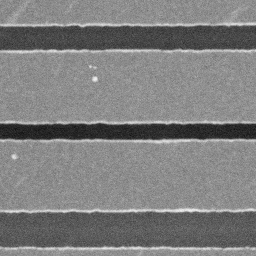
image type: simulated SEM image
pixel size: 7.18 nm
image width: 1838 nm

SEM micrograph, lines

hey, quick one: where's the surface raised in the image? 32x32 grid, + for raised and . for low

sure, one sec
++++++++++++++++++++++++++++++++
++++++++++++++++++++++++++++++++
++++++++++++++++++++++++++++++++
................................
................................
................................
++++++++++++++++++++++++++++++++
++++++++++++++++++++++++++++++++
++++++++++++++++++++++++++++++++
++++++++++++++++++++++++++++++++
++++++++++++++++++++++++++++++++
++++++++++++++++++++++++++++++++
++++++++++++++++++++++++++++++++
++++++++++++++++++++++++++++++++
++++++++++++++++++++++++++++++++
................................
................................
++.+..+++.++++........++++++++++
++++++++++++++++++++++++++++++++
++++++++++++++++++++++++++++++++
++++++++++++++++++++++++++++++++
++++++++++++++++++++++++++++++++
++++++++++++++++++++++++++++++++
++++++++++++++++++++++++++++++++
++++++++++++++++++++++++++++++++
++++++++++++++++++++++++++++++++
...++...........................
................................
................................
................................
................................
++++++++++++++++++++++++++++++++